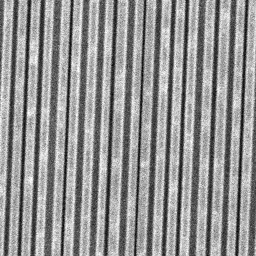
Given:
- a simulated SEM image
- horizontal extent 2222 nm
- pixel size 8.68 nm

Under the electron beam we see parallel lines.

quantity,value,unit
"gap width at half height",48.8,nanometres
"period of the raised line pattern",125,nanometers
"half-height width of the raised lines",72.7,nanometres